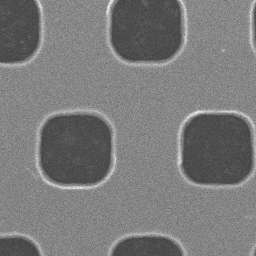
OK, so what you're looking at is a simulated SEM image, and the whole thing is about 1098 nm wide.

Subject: holes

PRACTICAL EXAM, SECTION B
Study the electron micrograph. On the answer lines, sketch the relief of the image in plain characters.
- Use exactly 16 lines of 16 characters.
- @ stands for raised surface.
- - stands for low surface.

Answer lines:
--@@@@@----@@@@@
---@@@@----@@@@@
--@@@@@----@@@@@
--@@@@@@---@@@@@
@@@@@@@@@@@@@@@@
@@@@@@@@@@@@@@@@
@@@@@@@@@@@@@@@@
@@@---@@@@@@---@
@@@----@@@@-----
@@-----@@@@-----
@@@----@@@@-----
@@@@--@@@@@@@--@
@@@@@@@@@@@@@@@@
@@@@@@@@@@@@@@@@
@@@@@@@@@@@@@@@@
--@@@@@----@@@@@